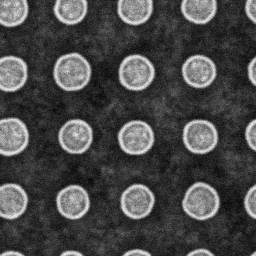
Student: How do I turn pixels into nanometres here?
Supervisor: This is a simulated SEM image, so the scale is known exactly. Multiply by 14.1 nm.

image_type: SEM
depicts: a regular array of raised bodies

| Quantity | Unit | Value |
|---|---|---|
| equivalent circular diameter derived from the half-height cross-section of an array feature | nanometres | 449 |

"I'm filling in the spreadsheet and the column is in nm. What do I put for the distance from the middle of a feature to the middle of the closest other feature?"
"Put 898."